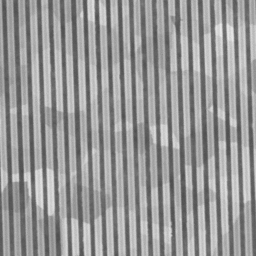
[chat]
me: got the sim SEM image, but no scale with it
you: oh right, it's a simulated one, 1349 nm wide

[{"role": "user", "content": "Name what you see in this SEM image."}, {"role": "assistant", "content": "parallel lines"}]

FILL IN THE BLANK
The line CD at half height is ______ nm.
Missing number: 27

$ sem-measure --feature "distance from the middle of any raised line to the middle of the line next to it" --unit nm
60.8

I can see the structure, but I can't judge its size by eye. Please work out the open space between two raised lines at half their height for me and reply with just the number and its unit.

31.6 nanometers